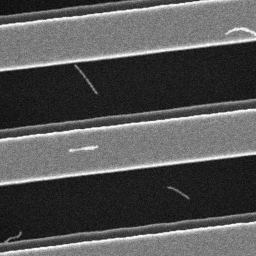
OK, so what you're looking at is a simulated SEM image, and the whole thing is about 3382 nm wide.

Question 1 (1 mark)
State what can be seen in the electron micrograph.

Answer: lines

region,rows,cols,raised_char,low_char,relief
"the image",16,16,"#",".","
....############
################
################
########........
................
................
.............###
.....###########
################
################
#########.......
................
................
...............#
......##########
################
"